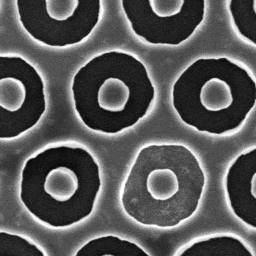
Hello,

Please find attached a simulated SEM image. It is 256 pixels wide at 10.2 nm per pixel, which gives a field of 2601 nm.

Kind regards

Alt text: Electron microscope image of ring-shaped grooves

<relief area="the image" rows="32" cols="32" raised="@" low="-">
@@----@@@@--@@@----@@@@---@@----
@@----@@@---@@@@---@@@---@@@@---
@@@---------@@@@---------@@@@---
@@@---------@@@@--------@@@@@---
@@@@-------@@@@@@-------@@@@@@--
@@@@@@---@@@@@@@@@@@@-@@@@@@@@@@
@@@@@@@@@@@@@@-@@@@@@@@@@@@@@@@@
---@@@@@@@@------@@@@@@@@----@@@
----@@@@@@--------@@@@@-------@@
-----@@@@---------@@@@@--------@
@@@--@@@@----@@----@@@----@@----
@@@--@@@@---@@@@---@@@---@@@@---
@@@---@@@---@@@@---@@@---@@@@---
-@----@@@----@@----@@@----@@---@
-----@@@@@--------@@@@@--------@
----@@@@@@@------@@@@@@-------@@
---@@@@@@@@@---@@@@@@@@@@@--@@@@
@@@@@@@@@@@@@@@@@@@@@@@@@@@@@@@@
@@@@@@-----@@@@@@@@@@@@@@@@@@@@@
@@@@--------@@@@@@@@@@@@@@@@@@--
@@@---------@@@@@@--@@@@@@@@@---
@@@---@@----@@@@@--@@@@@@@@@----
@@@---@@@---@@@@@-@@@@@@@@@@---@
@@@---@@@@--@@@@@-@@@@@@@@@@---@
@@@----@@---@@@@@@-@@@@@@@@@@---
@@@---------@@@@@@@@@@@@@@@@@---
@@@@-------@@@@@@@@@@@@@@@@@@---
@@@@@-----@@@@@@@@@@@@@@@@@@@@--
@@@@@@@@@@@@@@@@@@@@@@@@@@@@@@@@
--@@@@@@@@@@@-@@@@@@@@@@@@@--@@@
----@@@@@@@------@@@@@@@-------@
-----@@@@@--------@@@@---------@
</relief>